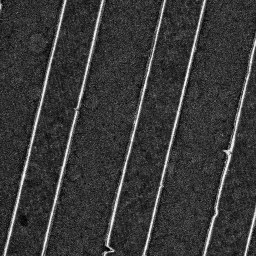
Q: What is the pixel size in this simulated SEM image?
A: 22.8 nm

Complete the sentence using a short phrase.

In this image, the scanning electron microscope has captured one or a few lines or trenches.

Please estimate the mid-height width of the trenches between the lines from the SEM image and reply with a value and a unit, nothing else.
1370 nm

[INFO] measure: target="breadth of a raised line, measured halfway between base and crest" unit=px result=37.7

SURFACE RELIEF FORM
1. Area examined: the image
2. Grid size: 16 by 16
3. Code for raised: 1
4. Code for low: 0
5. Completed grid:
0000110000111000
0000110000110000
0000110000110000
0001110000110000
0001100001110000
0001100001100001
0001100001100001
0011100001100001
0011000011100001
0011000011100011
0011000011000011
0111000011000011
0110000111000011
0110000111000111
0110000110000111
1110000110000110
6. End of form